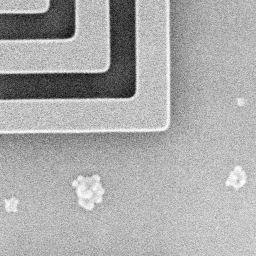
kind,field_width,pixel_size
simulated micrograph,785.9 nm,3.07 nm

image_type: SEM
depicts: groups of lines, slits or small figures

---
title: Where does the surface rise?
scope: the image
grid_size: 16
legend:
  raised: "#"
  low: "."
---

###..##..##.....
.....##..##.....
...####..##.....
#######..##.....
######...##.....
.........##.....
###########.....
###########.....
................
................
................
................
................
................
................
................